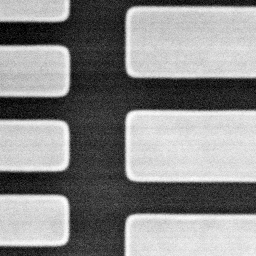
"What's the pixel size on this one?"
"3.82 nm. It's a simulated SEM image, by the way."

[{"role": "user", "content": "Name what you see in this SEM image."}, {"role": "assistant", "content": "groups of lines, slits or small figures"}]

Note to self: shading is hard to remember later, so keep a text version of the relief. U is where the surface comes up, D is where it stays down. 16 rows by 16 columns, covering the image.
UUUUDDDDDDDDDDDD
DDDDDDDDUUUUUUUU
DDDDDDDDUUUUUUUU
UUUUDDDDUUUUUUUU
UUUUDDDDUUUUUUUU
UUUUDDDDDDDDDDDD
DDDDDDDDDDDDDDDD
DDDDDDDDUUUUUUUU
UUUUDDDDUUUUUUUU
UUUUDDDDUUUUUUUU
UUUUDDDDUUUUUUUU
DDDDDDDDDDDDDDDD
UUUUDDDDDDDDDDDD
UUUUDDDDDUUUDDDD
UUUUDDDDUUUUUUUU
DDDDDDDDUUUUUUUU